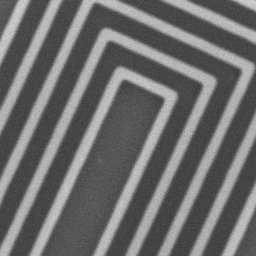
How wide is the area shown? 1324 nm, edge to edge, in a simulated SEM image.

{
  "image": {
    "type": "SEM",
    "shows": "groups of lines, slits or small figures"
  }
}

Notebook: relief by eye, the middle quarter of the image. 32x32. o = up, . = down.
.....ooo.................oooooo.
.....oo......ooo............oooo
....ooo.....oooooo............oo
....ooo.....oooooooo............
...ooo.....ooo...ooooo..........
...ooo.....ooo.....oooooo.......
..ooo.....ooo........oooooo.....
..ooo.....ooo..........ooooo....
.ooo......oo.............ooo....
.ooo.....ooo.............ooo....
.oo......oo..............oo.....
ooo.....ooo.............ooo.....
oo......oo..............oo......
oo.....ooo.............ooo.....o
o......oo..............ooo.....o
o.....ooo.............ooo......o
o.....ooo.............oo......oo
.....ooo.............ooo......oo
.....ooo.............ooo.....ooo
....ooo.............ooo.....ooo.
....ooo.............ooo.....ooo.
....oo..............oo......oo..
...ooo.............ooo.....ooo..
...oo..............oo......oo...
..ooo.............ooo.....ooo...
..oo..............oo......oo....
.ooo.............ooo.....ooo....
.oo..............oo......oo.....
ooo.............ooo.....ooo.....
ooo.............ooo.....ooo.....
oo..............oo......oo......
oo.............ooo.....ooo.....o